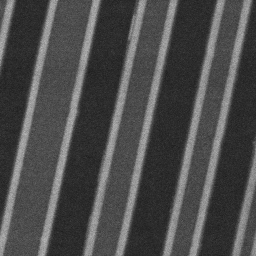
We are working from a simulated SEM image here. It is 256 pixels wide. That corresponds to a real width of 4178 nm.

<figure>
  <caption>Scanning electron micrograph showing one or a few lines or trenches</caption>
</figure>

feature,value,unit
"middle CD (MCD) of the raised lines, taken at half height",720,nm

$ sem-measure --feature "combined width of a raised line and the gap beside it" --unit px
76.2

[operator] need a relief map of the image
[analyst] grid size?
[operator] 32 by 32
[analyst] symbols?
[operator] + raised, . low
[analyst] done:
.++++++.....++++++....++++++...+
.+++++......++++++...++++++....+
.+++++......+++++....++++++...++
.+++++.....++++++....++++++...++
++++++.....++++++....++++++...++
++++++.....++++++....+++++....++
+++++......+++++....++++++....++
+++++......+++++....++++++...+++
+++++.....++++++....++++++...+++
+++++.....++++++....++++++...+++
++++......++++++....+++++....+++
++++......+++++....++++++...++++
++++.....++++++....++++++...++++
++++.....++++++....++++++...++++
++++.....++++++....++++++...++++
+++......+++++....++++++....++++
+++......+++++....++++++....++++
+++.....++++++....++++++...+++++
+++.....++++++....++++++...+++++
+++.....++++++....+++++....+++++
++......+++++....++++++....+++++
++......+++++....++++++...++++++
++.....++++++....++++++...++++++
++.....++++++....++++++...+++++.
+......+++++.....+++++....+++++.
+......+++++....++++++...++++++.
+.....++++++....++++++...++++++.
+.....++++++....++++++...+++++..
+.....++++++....++++++...+++++..
......+++++....++++++....+++++..
......+++++....++++++...++++++..
.....++++++....++++++...++++++..